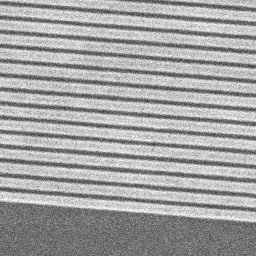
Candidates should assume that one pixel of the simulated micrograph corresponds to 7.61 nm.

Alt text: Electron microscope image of parallel lines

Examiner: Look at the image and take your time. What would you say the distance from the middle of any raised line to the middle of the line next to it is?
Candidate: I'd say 108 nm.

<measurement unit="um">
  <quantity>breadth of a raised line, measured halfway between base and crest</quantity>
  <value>0.0673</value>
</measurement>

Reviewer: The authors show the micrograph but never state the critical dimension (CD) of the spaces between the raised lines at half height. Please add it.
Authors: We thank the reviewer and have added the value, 40.8 nanometers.